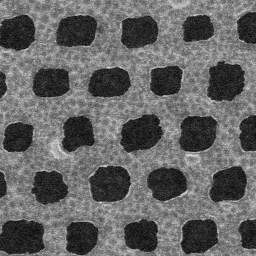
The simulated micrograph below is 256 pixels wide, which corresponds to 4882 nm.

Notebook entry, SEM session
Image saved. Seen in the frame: a regular array of holes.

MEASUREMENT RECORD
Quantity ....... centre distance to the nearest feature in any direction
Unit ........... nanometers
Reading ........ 1090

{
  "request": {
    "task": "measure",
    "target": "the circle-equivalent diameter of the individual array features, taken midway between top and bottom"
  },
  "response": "0.7 micrometres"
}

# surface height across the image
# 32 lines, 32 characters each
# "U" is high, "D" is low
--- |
UUUUUUUUUUUUUUUUUUUUUUUUUUUUUUUU
UUUUUUUUUUUUUUUUUUUUUUUUUUUUUUUD
UDDDUUUUDDDDUUUUDDDUUUUDDDUUUUDD
DDDDUUUDDDDDUUUDDDDDUUUDDDDUUUDD
DDDDUUUDDDDDUUUDDDDDUUUDDDDUUUDD
DDDDUUUDDDDUUUUDDDDUUUUUUUUUUUUD
UUUUUUUUUUUUUUUUUUUUUUUUUUUUUUUU
UUUUUUUUUUUUUUUUUUUUUUUUUUUUUUUU
UUUUUUUUUUUUUUDUUUUDDDUUUUDDDDUU
DUUUDDDDDUUDDDDDUUUDDDDUUUDDDDDU
DUUUDDDDDUUDDDDDUUUDDDDUUUDDDDDU
DUUUDDDDUUUDDDDDUUUDDDUUUUDDDDUU
UUUUUUUUUUUUUUUUUUUUUUUUUUDDDUUU
UUUUUUUUUUUUUUUUUUUUUUUUUUUUUUUU
UUUUUUUUUDDUUUUUUUDDUUUUUUUUUUUD
UDDUUUUUDDDUUUUUDDDDUUUDDDDUUUDD
UDDDUUUUDDDDUUUDDDDDUUUDDDDUUUDD
DDDDUUUUDDDDUUUDDDDDUUDDDDDUUUDD
DDDDUUUUDDUUUUUDDDDUUUUDDDUUUUDD
UUUUUUUUUUUUUUUUUUUUUUUUUUUUUUUU
UUUUUUUUUUUUUUUUUUUUUUUUUUUUUUUU
UUUUUDDUUUUUDDDDUUUDDDDUUUUDDDDU
DUUUDDDDUUUDDDDDUUDDDDDUUUUDDDDU
DUUUDDDDDUUDDDDDUUUDDDDUUUDDDDDU
UUUUDDDDUUUDDDDDUUUDDDDUUUDDDDUU
UUUUUDUUUUUUUUUUUUUUUUUUUUUUUUUU
UUUUUUUUUUUUUUUUUUUUUUUUUUUUUUUU
UDDUUUUUUUUUUUUUUDDUUUUUDDDUUUUD
DDDDDUUUDDDDUUUUDDDDUUUDDDDUUUDD
DDDDDUUUDDDDUUUUDDDDUUUDDDDUUUDD
DDDDDDUUDDDDUUUUDDDDUUUDDDDUUUDD
UDDDDUUUUDDUUUUUUUDUUUUDDDUUUUUU